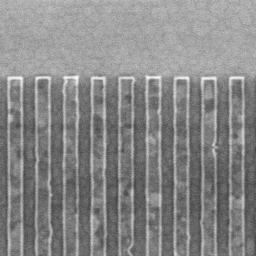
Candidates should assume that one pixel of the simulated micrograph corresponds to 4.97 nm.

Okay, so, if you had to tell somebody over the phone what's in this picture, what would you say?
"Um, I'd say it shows parallel lines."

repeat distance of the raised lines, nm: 138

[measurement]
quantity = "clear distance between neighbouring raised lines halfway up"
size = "72.7 nm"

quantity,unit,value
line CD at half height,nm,67.8